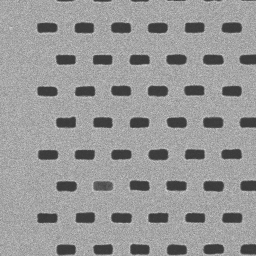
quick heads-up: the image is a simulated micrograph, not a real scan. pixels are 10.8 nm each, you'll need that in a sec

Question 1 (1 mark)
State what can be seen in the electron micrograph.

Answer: a regular array of holes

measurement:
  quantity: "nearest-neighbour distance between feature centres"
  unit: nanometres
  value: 389